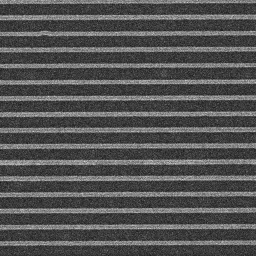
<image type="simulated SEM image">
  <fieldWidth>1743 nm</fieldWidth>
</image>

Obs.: parallel lines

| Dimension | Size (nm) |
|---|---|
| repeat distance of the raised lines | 110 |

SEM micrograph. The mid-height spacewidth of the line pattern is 86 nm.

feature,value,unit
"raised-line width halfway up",26.4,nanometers